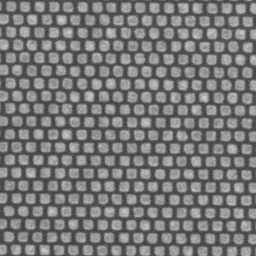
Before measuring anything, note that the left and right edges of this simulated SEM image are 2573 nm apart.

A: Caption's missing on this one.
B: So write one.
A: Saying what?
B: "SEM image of a regular array of raised bodies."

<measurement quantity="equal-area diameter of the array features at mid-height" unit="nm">96.2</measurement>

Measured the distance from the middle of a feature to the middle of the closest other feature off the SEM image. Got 142 nm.